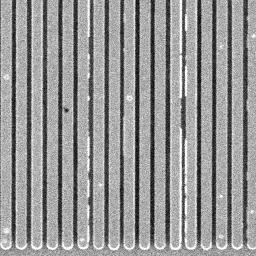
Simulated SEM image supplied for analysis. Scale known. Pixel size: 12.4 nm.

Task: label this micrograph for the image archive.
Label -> parallel lines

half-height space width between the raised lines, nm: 55.7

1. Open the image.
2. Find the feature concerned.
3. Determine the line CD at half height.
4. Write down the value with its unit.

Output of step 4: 133 nanometers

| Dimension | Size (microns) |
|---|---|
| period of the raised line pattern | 0.191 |